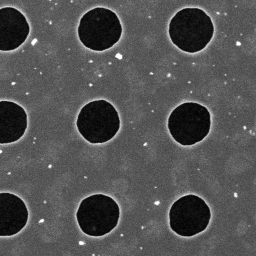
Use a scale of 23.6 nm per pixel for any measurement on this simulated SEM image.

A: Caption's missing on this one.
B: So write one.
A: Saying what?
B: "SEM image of holes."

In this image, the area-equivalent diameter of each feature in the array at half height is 42.9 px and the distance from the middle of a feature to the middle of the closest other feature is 91.4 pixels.